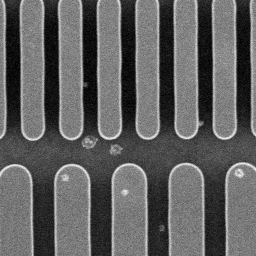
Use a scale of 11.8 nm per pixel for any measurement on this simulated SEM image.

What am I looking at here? groups of lines, slits or small figures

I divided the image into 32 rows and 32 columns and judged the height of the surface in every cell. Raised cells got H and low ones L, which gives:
HLLHHLLHHHLLHHHLLHHHLLHHHLLHHLLH
HLLHHLLHHHLLHHHLLHHHLLHHHLLHHLLH
HLLHHLLHHHLLHHHLLHHHLLHHHLLHHLLH
HLLHHLLHHHLLHHHLLHHHLLHHHLLHHLLH
HLLHHLLHHHLLHHHLLHHHLLHHHLLHHLLH
HLLHHLLHHHLLHHHLLHHHLLHHHLLHHLLH
HLLHHLLHHHLLHHHLLHHHLLHHHLLHHLLH
HLLHHHLHHHLLHHHLLHHHLLHHHLLHHLLH
HLLHHHLHHHLLHHHLLHHHLLHHHLLHHLLH
HLLHHHLLHHLLHHHLLHHHLLHHHLLHHLLH
HLLHHLLLHHLLHHHLLHHHLLHHHLLHHLLH
HLLHHLLLHHLLHHHLLHHHLLHHHLLHHLLH
HLLHHLLLHHLLHHHLLHHHLLHHHLLHHLLH
HLLHHLLLHHLLHHHLLHHHLLHHHLLHHLLH
HLLHHHLLHHLLHHHLLHHHLLHHHLLHHLLH
HLLHHHLLHHLLHHHLLHHHLLHHHLLHHHLH
HLLHHLLLHHLLHHHLLHHHLLHHHLLHHLLL
LLLLLLLLLLLLLLLLLLLLLLLLLLLLLLLL
LLLLLLLLLLLLLLLLLLLLLLLLLLLLLLLL
LLLLLLLLLLLLLLLLLLLLLLLLLLLLLLLL
LLLLLLLLLLLLLLLLLLLLLLLHLLLLLLHL
HHHHLLLHHHHLLLHHHHLLLHHHHLLLLHHH
HHHHLLLHHHHLLLHHHHLLLHHHHLLLHHHH
HHHHLLLHHHHLLLHHHHLLLHHHHLLLHHHH
HHHHLLLHHHHLLLHHHHLLLHHHHLLLHHHH
HHHHLLLHHHHLLLHHHHLLLHHHHLLLHHHH
HHHHLLLHHHHLLLHHHHLLLHHHHLLLHHHH
HHHHLLLHHHHLLLHHHHLLLHHHHLLLHHHH
HHHHLLLHHHHLLLHHHHLLLHHHHLLLHHHH
HHHHLLLHHHHLLLHHHHLLLHHHHLLLHHHH
HHHHLLLHHHHLLLHHHHLLLHHHHLLLHHHH
HHHHLLLHHHHLLLHHHHLLLHHHHLLLHHHH